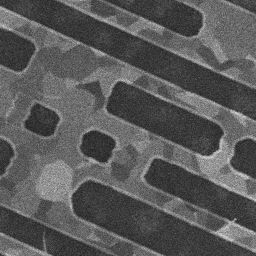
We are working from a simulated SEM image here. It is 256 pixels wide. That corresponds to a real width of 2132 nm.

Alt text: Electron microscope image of parallel lines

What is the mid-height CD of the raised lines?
0.14 micrometres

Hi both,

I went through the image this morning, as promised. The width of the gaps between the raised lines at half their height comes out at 258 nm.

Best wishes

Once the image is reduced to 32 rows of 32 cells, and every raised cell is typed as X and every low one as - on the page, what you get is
--------XXXXXX----------XXXXX---
X----------XXXXX---------XXXXXX-
XXX----------XXXXX--------XXXXXX
-XXXXX---------XXXXX-----XXXXXXX
---XXXXX---------XXXXXX--XXXXXXX
----XXXXXX----------XXXXXXXXXXXX
-----XXXXXXX----------XXXXXXXXXX
----XXXXXXXXXXX---------XXXXXXXX
X--XXXXXXXXXXXXXX---------XXXXXX
XXXXXXXXXXXXXXXXXXX----------XXX
XXXXXXXXXXXXXX--XXXXX----------X
XXXXXXXXXXXXXX-----XXXX---------
XXXXXXXXXXXXX--------XXXXX------
XXXX--XXXXXXX----------XXXXX----
XXX----XXXXXXX------------XXXX--
XXX----XXXXXXXXX-----------XXXXX
XXXX---XXXX--XXXXX----------XXXX
-XXXXXXXXX-----XXXXXX-------XX--
--XXXXXXXX-----XXXXXXXX-----X---
--XXXXXXXXX---XXXXXXXXXXX--XX---
-XXXXXXXXXXXXXXXXXX---XXXXXXX---
-XXXXXXXXXXXXXXXXX------XXXXX---
XXXXXXXXXXX-XXXXXX--------XXXXXX
XXXXXXXXXX----XXXXX----------XXX
XXXXXXXXX--------XXXX----------X
XXXXXXXXX----------XXXXX--------
--XXXXXXX------------XXXXX------
-----XXXXX-------------XXXXX----
-------XXXXX--------------XXXX--
X--------XXXXX--------------XXXX
XXX--------XXXXXX-------------XX
XXXXX---------XXXXX-------------